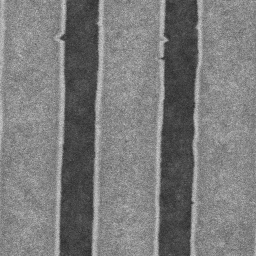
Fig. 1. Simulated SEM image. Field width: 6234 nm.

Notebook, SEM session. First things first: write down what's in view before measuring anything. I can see one or a few lines or trenches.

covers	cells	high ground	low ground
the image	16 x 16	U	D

UUUUDDUUUUDDDUUU
UUUUDDUUUUDDDUUU
UUUUDDUUUUDDDUUU
UUUUDDUUUUDDDUUU
UUUUDDUUUUDDUUUU
UUUUDDUUUUDDUUUU
UUUUDDUUUUDDUUUU
UUUUDDUUUUDDUUUU
UUUUDDUUUUDDUUUU
UUUUDDUUUUDDUUUU
UUUUDDUUUUDDUUUU
UUUUDDUUUUDDUUUU
UUUUDDUUUUDDUUUU
UUUUDDUUUUDDUUUU
UUUUDDUUUUDDUUUU
UUUUDDUUUUDDUUUU